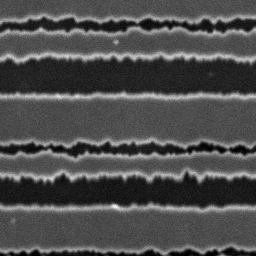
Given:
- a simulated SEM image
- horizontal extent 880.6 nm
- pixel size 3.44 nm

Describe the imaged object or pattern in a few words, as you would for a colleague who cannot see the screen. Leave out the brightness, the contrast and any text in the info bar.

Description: lines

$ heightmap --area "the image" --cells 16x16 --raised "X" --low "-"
XXXXXXXXXXXXXXXX
XXXXXXXXXXXXXXXX
XXXXXXXXXXXXXXXX
XXX-XXXXXXXXXXXX
----------------
----------------
XXXXXXXXXXXXXXXX
XXXXXXXXXXXXXXXX
XXXXXXXXXXXXXXXX
XXXXXXXXXXXXXXXX
XXXXXXXXXXXXXXXX
----------------
----------------
XXXXXXXXXXXXXXXX
XXXXXXXXXXXXXXXX
XXXXXXXXXXXXXXXX